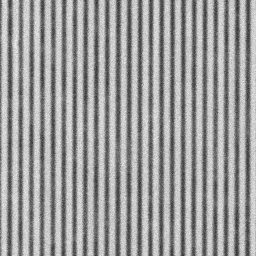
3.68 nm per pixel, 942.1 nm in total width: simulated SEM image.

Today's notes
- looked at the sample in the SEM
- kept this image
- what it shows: parallel lines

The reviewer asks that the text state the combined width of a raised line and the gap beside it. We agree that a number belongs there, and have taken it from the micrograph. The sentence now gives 39.9 nm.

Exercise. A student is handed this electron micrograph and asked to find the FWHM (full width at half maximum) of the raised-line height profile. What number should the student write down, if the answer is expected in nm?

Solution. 19.8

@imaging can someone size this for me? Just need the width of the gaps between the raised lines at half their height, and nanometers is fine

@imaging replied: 19.8